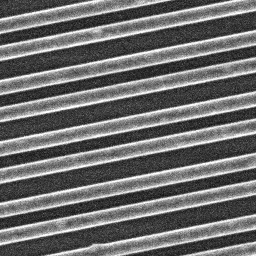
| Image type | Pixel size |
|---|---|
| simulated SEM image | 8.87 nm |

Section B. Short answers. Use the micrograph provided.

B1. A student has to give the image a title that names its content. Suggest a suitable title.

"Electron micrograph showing parallel lines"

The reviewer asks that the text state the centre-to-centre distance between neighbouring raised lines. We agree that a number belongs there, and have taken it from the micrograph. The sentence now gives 268 nm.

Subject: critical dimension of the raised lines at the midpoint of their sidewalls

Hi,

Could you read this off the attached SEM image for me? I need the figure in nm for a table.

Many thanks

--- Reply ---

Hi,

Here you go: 121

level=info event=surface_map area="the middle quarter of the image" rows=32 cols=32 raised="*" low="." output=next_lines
...*****************............
***************.................
**********.................*****
*****.................**********
.................***************
............*****************...
.......*****************........
..*****************.............
**************..................
*********.......................
****..........................**
.........................*******
....................************
...............*****************
..........*****************.....
.....*****************..........
*****************...............
************.................***
*******.................********
*.................**************
.............******************.
.........****************.......
...*****************............
***************.................
**********......................
*****...........................
............................****
......................**********
.................***************
............****************....
......*****************.........
..****************..............